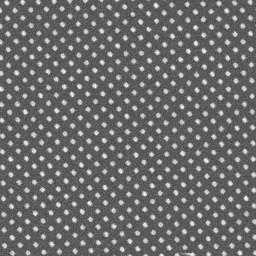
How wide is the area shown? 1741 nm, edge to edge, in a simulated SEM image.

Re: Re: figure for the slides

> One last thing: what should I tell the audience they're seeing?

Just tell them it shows a regular array of raised bodies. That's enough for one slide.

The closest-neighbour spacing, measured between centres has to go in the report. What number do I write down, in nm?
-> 73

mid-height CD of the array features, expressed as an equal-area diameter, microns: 0.0297